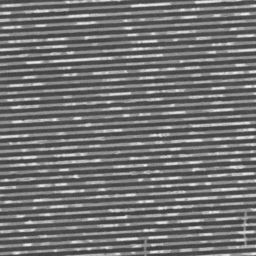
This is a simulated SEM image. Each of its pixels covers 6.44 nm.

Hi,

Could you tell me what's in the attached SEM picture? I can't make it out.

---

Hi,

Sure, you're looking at parallel lines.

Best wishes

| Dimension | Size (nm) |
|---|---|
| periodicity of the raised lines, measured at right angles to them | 46.8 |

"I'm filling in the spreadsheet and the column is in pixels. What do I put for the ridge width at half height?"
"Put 2.5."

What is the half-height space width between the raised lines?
32.1 nanometres